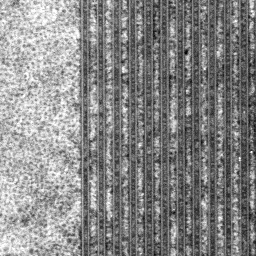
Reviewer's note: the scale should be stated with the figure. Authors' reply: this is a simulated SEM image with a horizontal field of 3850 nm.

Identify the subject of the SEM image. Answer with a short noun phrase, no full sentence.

parallel lines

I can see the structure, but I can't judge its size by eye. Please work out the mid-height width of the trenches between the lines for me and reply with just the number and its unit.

8.5 px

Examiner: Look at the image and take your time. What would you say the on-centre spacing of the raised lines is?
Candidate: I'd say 238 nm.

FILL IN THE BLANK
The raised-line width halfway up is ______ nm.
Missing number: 103